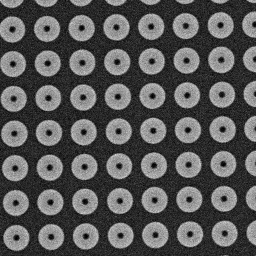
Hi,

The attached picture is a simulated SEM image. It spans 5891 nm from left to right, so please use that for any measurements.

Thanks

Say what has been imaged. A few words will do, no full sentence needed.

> an array of small figures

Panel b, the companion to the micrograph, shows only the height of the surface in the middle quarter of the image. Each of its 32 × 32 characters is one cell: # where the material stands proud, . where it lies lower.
.#######..######...######...####
..#####....#####....####....####
...###......###.................
................................
................................
....##......###.....####.....###
..#####....#####...######...####
..######..#######..######...####
..######..#######..######...####
..######...#####...######...####
..#####....#####....####.....###
................................
................................
..............................##
...####.....####....#####...####
..######...######..######...####
..######...######..######...####
..######...######..######...####
..######...#####....#####...####
...####.....###......###......##
................................
................................
.............##......###.....###
...####....#####....#####...####
..######...######..#######..####
..######...######..#######..####
..######...######...#####...####
..######...#####....#####....###
...####......##.................
................................
................................
....###.....###......####....###